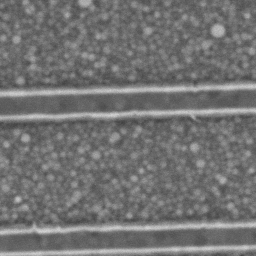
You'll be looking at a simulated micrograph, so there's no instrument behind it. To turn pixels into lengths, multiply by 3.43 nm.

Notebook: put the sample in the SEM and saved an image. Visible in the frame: one or a few lines or trenches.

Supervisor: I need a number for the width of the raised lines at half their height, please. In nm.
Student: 80.6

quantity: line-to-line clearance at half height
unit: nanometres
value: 390